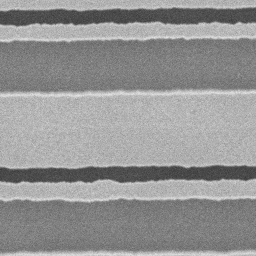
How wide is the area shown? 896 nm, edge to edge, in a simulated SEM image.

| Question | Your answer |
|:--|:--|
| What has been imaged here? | lines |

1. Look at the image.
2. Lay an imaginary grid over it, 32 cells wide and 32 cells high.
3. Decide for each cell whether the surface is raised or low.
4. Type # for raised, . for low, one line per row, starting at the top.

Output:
################################
................................
................................
################################
################################
................................
................................
................................
................................
................................
................................
...............................#
################################
################################
################################
################################
################################
################################
################################
################################
################################
................................
.....................#..........
################################
################################
................................
................................
................................
................................
................................
................................
................................